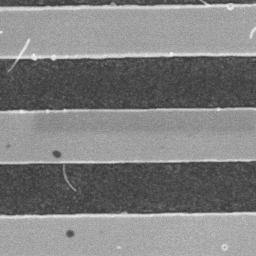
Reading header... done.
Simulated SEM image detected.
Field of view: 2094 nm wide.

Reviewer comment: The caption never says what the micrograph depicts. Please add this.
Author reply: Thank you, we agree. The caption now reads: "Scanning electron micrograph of lines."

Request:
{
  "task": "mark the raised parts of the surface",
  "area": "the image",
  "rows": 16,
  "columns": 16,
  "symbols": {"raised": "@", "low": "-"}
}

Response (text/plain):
@@@@@@@@@@@@@@@@
@@@@@@@@@@@@@@@@
@@@@@@@@@@@@@@@@
@@@@@@@@@@@-----
----------------
----------------
----------------
@@@@@@@@@@@@@@@@
@@@@@@@@@@@@@@@@
@@@@@@@@@@@@@@@@
----------------
----------------
----------------
@@@@@@@@@@@@@@@@
@@@@@@@@@@@@@@@@
@@@@@@@@@@@@@@@@